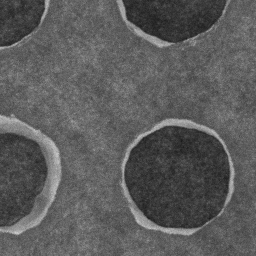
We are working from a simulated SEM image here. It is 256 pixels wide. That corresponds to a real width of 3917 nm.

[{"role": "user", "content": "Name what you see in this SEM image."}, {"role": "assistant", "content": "holes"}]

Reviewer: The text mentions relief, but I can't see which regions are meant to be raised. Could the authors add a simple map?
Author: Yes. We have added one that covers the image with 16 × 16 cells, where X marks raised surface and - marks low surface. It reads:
---XXXXX------XX
--XXXXXX-----XXX
-XXXXXXXXX--XXXX
XXXXXXXXXXXXXXXX
XXXXXXXXXXXXXXXX
XXXXXXXXXXXXXXXX
XXXXXXXXXXXXXXXX
XXXXXXXXXXXXXXXX
--XXXXXXX----XXX
---XXXXX------XX
---XXXXX------XX
---XXXXX------XX
---XXXXX------XX
---XXXXXX----XXX
XXXXXXXXXXXXXXXX
XXXXXXXXXXXXXXXX